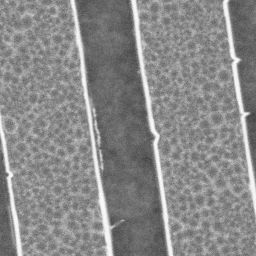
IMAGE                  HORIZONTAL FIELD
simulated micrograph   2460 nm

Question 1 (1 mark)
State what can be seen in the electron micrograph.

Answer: one or a few lines or trenches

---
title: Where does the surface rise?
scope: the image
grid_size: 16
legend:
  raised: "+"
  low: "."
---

+++++...++++++..
+++++....+++++..
+++++....+++++..
+++++....++++++.
+++++....++++++.
+++++....++++++.
+++++....++++++.
++++++...++++++.
++++++....+++++.
++++++....+++++.
++++++....++++++
.+++++....++++++
.+++++....++++++
.++++++...++++++
.++++++...++++++
.++++++....+++++